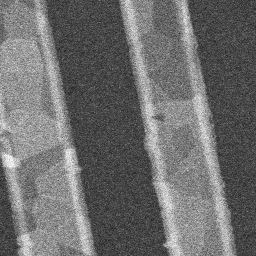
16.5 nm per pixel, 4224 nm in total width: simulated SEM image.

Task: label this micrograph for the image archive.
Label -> one or a few lines or trenches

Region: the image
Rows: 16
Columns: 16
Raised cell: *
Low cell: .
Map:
**......***.....
***.....***.....
***......***....
***......***....
***......***....
***......***....
****.....***....
****.....****...
****......***...
.***......***...
.***......***...
.****.....****..
.****.....****..
.****......***..
.****......***..
..***......***..